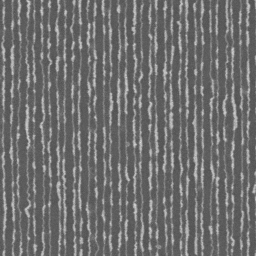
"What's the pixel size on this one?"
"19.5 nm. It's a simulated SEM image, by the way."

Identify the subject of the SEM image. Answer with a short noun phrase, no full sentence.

parallel lines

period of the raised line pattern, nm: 298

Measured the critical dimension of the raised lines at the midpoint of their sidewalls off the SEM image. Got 153 nm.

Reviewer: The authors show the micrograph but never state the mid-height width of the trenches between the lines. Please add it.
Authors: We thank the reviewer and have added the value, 144 nm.